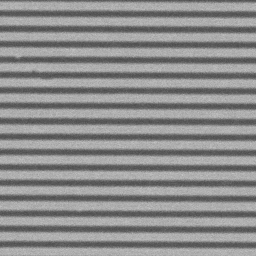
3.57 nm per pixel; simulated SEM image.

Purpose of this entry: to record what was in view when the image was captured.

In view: parallel lines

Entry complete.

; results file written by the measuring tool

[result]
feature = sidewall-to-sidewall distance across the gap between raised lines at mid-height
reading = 25.5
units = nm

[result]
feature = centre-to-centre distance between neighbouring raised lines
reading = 55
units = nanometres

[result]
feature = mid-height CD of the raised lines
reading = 31.7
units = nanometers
